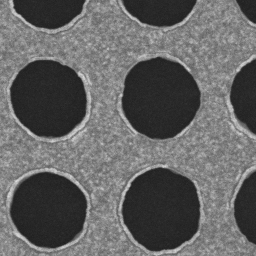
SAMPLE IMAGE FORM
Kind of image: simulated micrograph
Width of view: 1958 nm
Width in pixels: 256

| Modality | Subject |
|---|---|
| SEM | holes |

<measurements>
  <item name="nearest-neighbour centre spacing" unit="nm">851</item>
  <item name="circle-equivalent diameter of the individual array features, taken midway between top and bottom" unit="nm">603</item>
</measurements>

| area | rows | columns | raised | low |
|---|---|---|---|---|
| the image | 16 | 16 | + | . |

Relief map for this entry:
+....+++....+++.
++..+++++..+++++
++++++++++++++++
++++++++++++++++
+....+++....+++.
+....+++....++..
+....+++....++..
+....+++....+++.
++..+++++..+++++
++++++++++++++++
++++++++++++++++
+....+++....+++.
+....+++....+++.
+....+++....+++.
+....+++....+++.
+++++++++..+++++